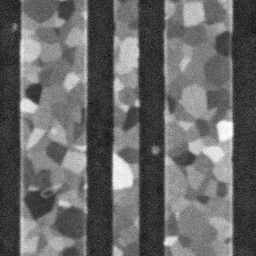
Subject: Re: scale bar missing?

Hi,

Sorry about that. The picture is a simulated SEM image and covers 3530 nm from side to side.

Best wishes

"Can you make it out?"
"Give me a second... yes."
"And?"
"lines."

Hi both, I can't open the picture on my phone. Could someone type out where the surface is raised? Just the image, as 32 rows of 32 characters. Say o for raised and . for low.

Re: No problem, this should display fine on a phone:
...oooooooo...ooo....oooooooo...
...oooooooo...ooo....oooooooo...
...oooooooo...ooo....oooooooo...
...oooooooo...ooo....oooooooo...
...oooooooo...ooo....oooooooo...
...oooooooo...ooo....oooooooo...
...oooooooo...ooo....oooooooo...
...oooooooo...ooo....oooooooo...
...oooooooo...ooo....oooooooo...
...oooooooo...ooo....oooooooo...
...oooooooo...ooo....oooooooo...
...oooooooo...ooo....oooooooo...
...oooooooo...ooo....oooooooo...
...oooooooo...ooo....oooooooo...
...oooooooo...ooo....oooooooo...
...oooooooo...ooo....oooooooo...
...oooooooo...ooo....oooooooo...
...oooooooo...ooo....oooooooo...
...oooooooo...ooo....oooooooo...
...oooooooo...ooo....oooooooo...
...oooooooo...ooo....oooooooo...
...oooooooo...ooo....oooooooo...
...oooooooo...ooo....oooooooo...
...oooooooo...ooo....oooooooo...
...oooooooo...ooo....oooooooo...
...oooooooo...ooo....oooooooo...
...oooooooo...ooo....oooooooo...
...oooooooo...ooo....oooooooo...
...oooooooo...ooo....oooooooo...
...oooooooo...ooo....oooooooo...
...oooooooo...ooo....oooooooo...
...oooooooo...ooo....oooooooo...